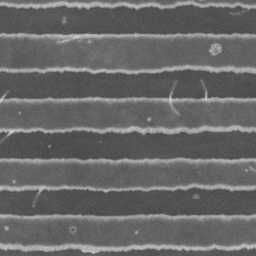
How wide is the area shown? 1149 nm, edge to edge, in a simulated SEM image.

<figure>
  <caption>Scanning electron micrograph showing lines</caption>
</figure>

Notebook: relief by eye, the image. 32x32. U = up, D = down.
UUUUUUUUUUUUUUUUUUUUUUUUUUUUUUUU
DDDDDDDDDDDDDDDDDDDDDDDDDDDDDDDD
DDDDDDDDDDDDDDDDDDDDDDDDDDDDDDDD
DDDDDDDDDDDDDDDDDDDDDDDDDDDDDDDD
UUUUUUUUUUUUUUUUUUUUUUUUUUUUUUUU
UUUUUUUUUUUUUUUUUUUUUUUUUUUUUUUU
UUUUUUUUUUUUUUUUUUUUUUUUUUUUUUUU
UUUUUUUUUUUUUUUUUUUUUUUUUUUUUUUU
UUUUUUUUUUUUUUUUUUUUUUUUUUUUUUUU
DDDDDDDDDDDDDDDDDDDDDDDDDDDDDDDD
DDDDDDDDDDDDDDDDDDDDDDDDDDDDDDDD
DDDDDDDDDDDDDDDDDDDDDDDDDDDDDDDD
UUUUUUUUUUUUUUUUUUUUUUUUUUUUUUUU
UUUUUUUUUUUUUUUUUUUUUUUUUUUUUUUU
UUUUUUUUUUUUUUUUUUUUUUUUUUUUUUUU
UUUUUUUUUUUUUUUUUUUUUUUUUUUUUUUU
DUDDDDUDDDDDUDDDDDDDUUDUDDDDDDDD
DDDDDDDDDDDDDDDDDDDDDDDDDDDDDDDD
DDDDDDDDDDDDDDDDDDDDDDDDDDDDDDDD
DDDDDDDDDDDDDDDDDDDDDDDDDDDDDDDD
UUUUUUUUUUUUUUUUUUUUUUUUUUUUUUUU
UUUUUUUUUUUUUUUUUUUUUUUUUUUUUUUU
UUUUUUUUUUUUUUUUUUUUUUUUUUUUUUUU
UUUUUUUUUUUUUUUUUUUUUUUUDUUUUUUU
DDDDDDDDDDDDDDDDDDDDDDDDDDDDDDDD
DDDDDDDDDDDDDDDDDDDDDDDDDDDDDDDD
DDDDDDDDDDDDDDDDDDDDDDDDDDDDDDDD
UUUUUUUUUUUUUUUUUUUUUUUUUUUUUUUU
UUUUUUUUUUUUUUUUUUUUUUUUUUUUUUUU
UUUUUUUUUUUUUUUUUUUUUUUUUUUUUUUU
UUUUUUUUUUUUUUUUUUUUUUUUUUUUUUUU
DDDDDDDDDDDDDDDDDDDDDDDDDDDDDDDD